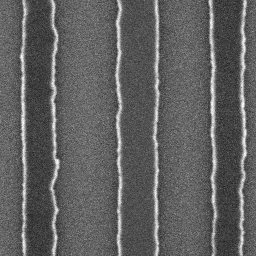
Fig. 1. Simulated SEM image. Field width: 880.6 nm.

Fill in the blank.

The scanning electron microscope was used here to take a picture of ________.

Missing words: lines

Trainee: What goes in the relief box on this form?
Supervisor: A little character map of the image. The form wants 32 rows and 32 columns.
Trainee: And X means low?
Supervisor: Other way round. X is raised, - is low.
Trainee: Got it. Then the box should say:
---XXXX--------XXXX-------XXXXX-
---XXXX--------XXXXX------XXXXX-
---XXXX--------XXXXX------XXXX--
---XXXX--------XXXXX------XXXX--
---XXXX--------XXXXX------XXXXX-
---XXXX--------XXXXX------XXXXX-
---XXXX--------XXXXX------XXXXX-
---XXXX--------XXXXX------XXXX--
---XXXX--------XXXXX-------XXXX-
---XXXX--------XXXXX-------XXX--
---XXXX--------XXXXX------XXXX--
---XXXX--------XXXXX------XXXX--
---XXXX--------XXXXX------XXXX--
---XXXX--------XXXXX------XXXX--
---XXXX--------XXXXX-------XXXX-
---XXXX--------XXXX-------XXXXX-
---XXXX--------XXXX-------XXXXX-
---XXXX--------XXXX-------XXXXX-
---XXXX--------XXXX--------XXXX-
---XXXX--------XXXXX-------XXXX-
---XXXX--------XXXXX-------XXX--
---XXXX--------XXXXX-------XXX--
---XXXX--------XXXX-------XXXX--
---XXXX--------XXXX--------XXX--
---XXXX--------XXXX--------XXX--
---XXXX--------XXXXX-------XXX--
---XXXX--------XXXXX-------XXX--
---XXXX--------XXXXX-------XXX--
---XXXX--------XXXXX-------XXX--
---XXXX--------XXXXX-------XXX--
---XXXX--------XXXXX-------XXX--
---XXXX--------XXXXX-------XXX--